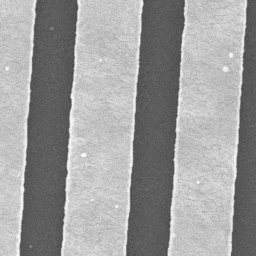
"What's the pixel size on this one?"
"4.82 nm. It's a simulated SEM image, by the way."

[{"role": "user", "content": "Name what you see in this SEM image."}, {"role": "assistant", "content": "lines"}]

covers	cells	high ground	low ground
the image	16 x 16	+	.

++...++++...+++.
++...++++...+++.
++...++++..++++.
++...++++..++++.
++...++++..++++.
++...+++...++++.
++..++++...++++.
++..++++...++++.
++..++++...++++.
++..++++...++++.
++..++++...++++.
+...++++...++++.
+...++++...++++.
+...++++...++++.
+...++++...++++.
+...++++...+++..